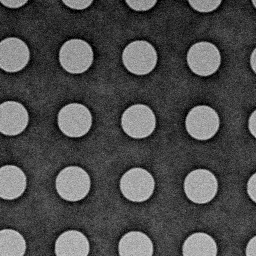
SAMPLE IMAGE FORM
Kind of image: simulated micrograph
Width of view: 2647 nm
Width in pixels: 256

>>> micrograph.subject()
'an array of small figures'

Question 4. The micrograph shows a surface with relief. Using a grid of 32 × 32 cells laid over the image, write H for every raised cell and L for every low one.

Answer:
HHHLLLLLHHHLLLLLHHHLLLLLHHHLLLLL
LLLLLLLLLLLLLLLLLLLLLLLLLLLLLLLL
LLLLLLLLLLLLLLLLLLLLLLLLLLLLLLLL
LLLLLLLLLLLLLLLLLLLLLLLLLLLLLLLL
LLLLLLLLLLLLLLLLLLLLLLLLLLLLLLLL
HHHLLLLLHHHLLLLLHHHLLLLLLHLLLLLL
HHHHLLLHHHHHLLLHHHHLLLLLHHHLLLLL
HHHHLLLHHHHHLLLHHHHHLLLHHHHLLLLH
HHHLLLLLHHHLLLLLHHHLLLLLHHHLLLLL
LLLLLLLLLLLLLLLLLLLLLLLLLLLLLLLL
LLLLLLLLLLLLLLLLLLLLLLLLLLLLLLLL
LLLLLLLLLLLLLLLLLLLLLLLLLLLLLLLL
LLLLLLLLLLLLLLLLLLLLLLLLLLLLLLLL
HHHLLLLLHHHLLLLLHHHLLLLLHHLLLLLL
HHHLLLLHHHHLLLLHHHHLLLLHHHHLLLLH
HHHLLLLHHHHLLLLHHHHLLLLHHHHLLLLH
HHHLLLLLHHHLLLLLHHHLLLLLHHHLLLLH
LLLLLLLLLLLLLLLLLLLLLLLLLLLLLLLL
LLLLLLLLLLLLLLLLLLLLLLLLLLLLLLLL
LLLLLLLLLLLLLLLLLLLLLLLLLLLLLLLL
LLLLLLLLLLLLLLLLLLLLLLLLLLLLLLLL
HHHLLLLLHHHLLLLLHHLLLLLLHHLLLLLL
HHHLLLLHHHHLLLLHHHHLLLLHHHHLLLLH
HHHLLLLHHHHLLLLHHHHLLLLHHHHLLLLH
HHLLLLLLHHHLLLLLHHHLLLLHHHHLLLLH
LLLLLLLLLLLLLLLLLLLLLLLLLLLLLLLL
LLLLLLLLLLLLLLLLLLLLLLLLLLLLLLLL
LLLLLLLLLLLLLLLLLLLLLLLLLLLLLLLL
LLLLLLLLLLLLLLLLLLLLLLLLLLLLLLLL
HHHLLLLLHHHLLLLLHHLLLLLLHHLLLLLL
HHHLLLLHHHHLLLLHHHHLLLLHHHHLLLLH
HHHLLLLHHHHLLLLHHHHLLLLHHHHLLLLH